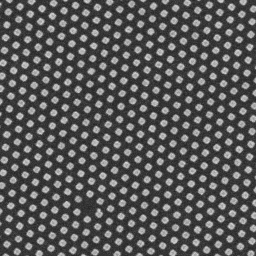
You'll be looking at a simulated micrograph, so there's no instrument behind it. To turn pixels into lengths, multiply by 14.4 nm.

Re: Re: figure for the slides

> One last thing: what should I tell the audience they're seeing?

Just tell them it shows a regular array of raised bodies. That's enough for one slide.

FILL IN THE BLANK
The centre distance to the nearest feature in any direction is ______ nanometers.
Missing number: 182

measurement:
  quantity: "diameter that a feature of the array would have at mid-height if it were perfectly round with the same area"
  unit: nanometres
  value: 87.6